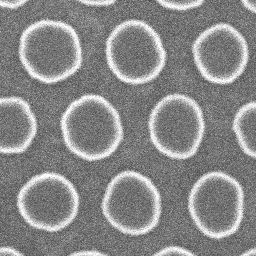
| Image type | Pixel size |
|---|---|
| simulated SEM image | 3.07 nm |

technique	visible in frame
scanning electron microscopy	a regular array of raised bodies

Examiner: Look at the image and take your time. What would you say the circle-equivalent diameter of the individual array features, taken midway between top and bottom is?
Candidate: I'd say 177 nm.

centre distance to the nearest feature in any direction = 0.26 micrometres